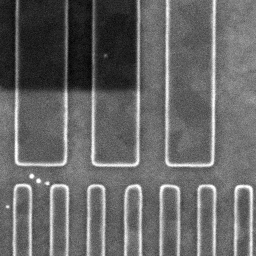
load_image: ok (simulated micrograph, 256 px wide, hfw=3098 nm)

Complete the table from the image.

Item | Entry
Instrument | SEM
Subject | wiring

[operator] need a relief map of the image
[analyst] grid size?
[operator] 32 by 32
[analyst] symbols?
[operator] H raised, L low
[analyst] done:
LLHHHHHHLLLLHHHHHLLLLHHHHHHLLLLL
LLHHHHHHLLLLHHHHHLLLLHHHHHHLLLLL
LLHHHHHHLLLLHHHHHLLLLHHHHHHLLLLL
LLHHHHHHLLLLHHHHHLLLLHHHHHHLLLLL
LLHHHHHHLLLLHHHHHLLLLHHHHHHLLLLL
LLHHHHHHLLLLHHHHHLLLLHHHHHHLLLLL
LLHHHHHHLLLLHHHHHLLLLHHHHHHLLLLL
LLHHHHHHLLLLHHHHHLLLLHHHHHHLLLLL
LLHHHHHHLLLLHHHHHLLLLHHHHHHLLLLL
LLHHHHHHLLLLHHHHHLLLLHHHHHHLLLLL
LLHHHHHHLLLLHHHHHLLLLHHHHHHLLLLL
LLHHHHHHLLLLHHHHHLLLLHHHHHHLLLLL
LLHHHHHHLLLLHHHHHLLLLHHHHHHLLLLL
LLHHHHHHLLLLHHHHHLLLLHHHHHHLLLLL
LLHHHHHHLLLLHHHHHLLLLHHHHHHLLLLL
LLHHHHHHLLLLHHHHHLLLLHHHHHHLLLLL
LLHHHHHHLLLLHHHHHLLLLHHHHHHLLLLL
LLHHHHHHLLLLHHHHHLLLLHHHHHHLLLLL
LLHHHHHHLLLLHHHHHLLLLHHHHHHLLLLL
LLHHHHHHLLLLHHHHHLLLLHHHHHHLLLLL
LLHHHHHHLLLLHHHHHLLLLHHHHHLLLLLL
LLLLLLLLLLLLLLLLLLLLLLLLLLLLLLLL
LLLLLLLLLLLLLLLLLLLLLLLLLLLLLLLL
LLHHLLLHLLLHHLLLHLLLHHLLLHHLLLHL
LLHHLLHHHLLHHLLLHHLLHHLLLHHLLHHL
LLHHLLHHLLLHHLLLHHLLHHLLLHHLLHHL
LLHHLLHHLLLHHLLLHHLLHHLLLHHLLHHL
LLHHLLHHLLLHHLLLHHLLHHLLLHHLLHHL
LLHHLLHHLLLHHLLLHHLLHHLLLHHLLHHL
LLHHLLHHLLLHHLLLHHLLHHLLLHHLLHHL
LLHHLLHHLLLHHLLLHHLLHHLLLHHLLHHL
LLHHLLHHLLLHHLLLHHLLHHLLLHHLLHHL